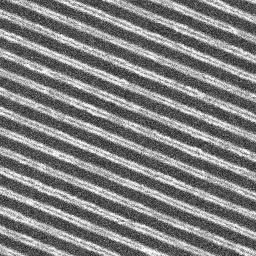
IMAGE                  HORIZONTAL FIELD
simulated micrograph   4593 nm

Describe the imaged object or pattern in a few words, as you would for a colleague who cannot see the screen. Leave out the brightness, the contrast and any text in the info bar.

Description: parallel lines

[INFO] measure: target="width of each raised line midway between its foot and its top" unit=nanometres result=108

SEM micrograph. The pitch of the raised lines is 0.326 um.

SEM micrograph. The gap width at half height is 0.213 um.